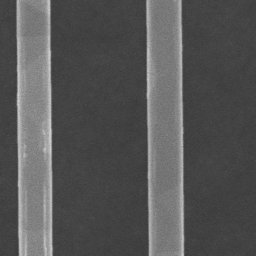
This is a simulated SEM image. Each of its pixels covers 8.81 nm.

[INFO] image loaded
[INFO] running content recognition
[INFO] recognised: wiring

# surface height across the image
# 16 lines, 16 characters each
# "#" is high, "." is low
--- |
.##......##.....
.##......##.....
.##......##.....
.##......##.....
.##......##.....
.##......##.....
.##......##.....
.##......##.....
.##......##.....
.##......##.....
.##......##.....
.##......##.....
.##......##.....
.##......##.....
.##......##.....
.##......##.....